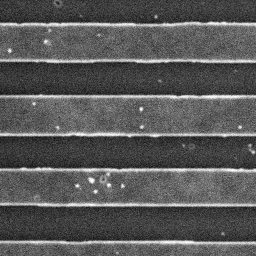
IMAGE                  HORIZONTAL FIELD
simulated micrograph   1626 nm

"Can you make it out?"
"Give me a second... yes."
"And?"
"lines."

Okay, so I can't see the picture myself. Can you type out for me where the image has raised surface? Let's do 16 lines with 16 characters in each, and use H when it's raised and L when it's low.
LLLLLLLLLLLLLLLL
HHHHHHHHHLHHHHHH
HHHHHHHHHHHHHHHH
HHHHHHHHHHHHHHHH
LLLLLLLLLLLLLLLL
LLLLLLLLLLLLLLLL
HHHHHHHHHHHHHHHH
HHHHHHHHHHHHHHHH
LLLLLLLLHHLLLLHL
LLLLLLLLLLLLLLLL
LLLLLLLLLLLLLLLL
HHHHHHHHHHHHHHHH
HHHHHHHHHHHHHHHH
LLLLLLLLLLLLLLLL
LLLLLLLLLLLLLLLL
HHHHHHHHHHHHHHHH